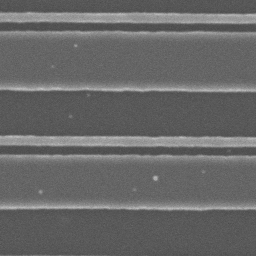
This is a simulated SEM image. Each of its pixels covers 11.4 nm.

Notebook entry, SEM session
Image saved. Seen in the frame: lines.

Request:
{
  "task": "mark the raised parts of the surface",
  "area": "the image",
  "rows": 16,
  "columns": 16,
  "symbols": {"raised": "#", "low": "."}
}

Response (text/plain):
................
################
################
################
################
################
................
................
................
################
################
################
################
................
................
................